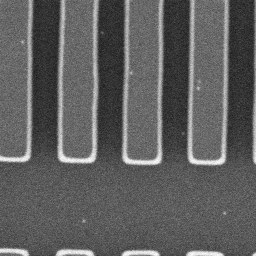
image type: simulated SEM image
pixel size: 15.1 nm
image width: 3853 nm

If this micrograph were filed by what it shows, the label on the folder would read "groups of lines, slits or small figures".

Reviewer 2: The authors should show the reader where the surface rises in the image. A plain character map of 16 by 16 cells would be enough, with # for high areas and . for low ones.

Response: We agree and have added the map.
##..##..##..##..
##..##..##..##..
##..##..##..##..
##..##..##..##..
##..##..##..##..
##..##..##..##..
##..##..##..##..
##..##..##..##..
##..##..##..##..
##..##..##..##..
................
................
................
................
................
................